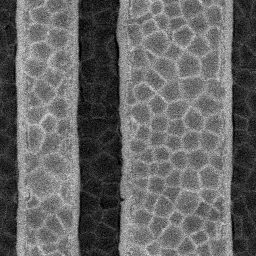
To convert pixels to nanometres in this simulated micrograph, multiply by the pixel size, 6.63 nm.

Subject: one or a few lines or trenches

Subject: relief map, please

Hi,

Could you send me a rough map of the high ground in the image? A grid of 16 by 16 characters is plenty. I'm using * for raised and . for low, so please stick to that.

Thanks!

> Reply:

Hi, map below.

.****...******..
.****...******..
.****...******..
.****...******..
.****...******..
.****...******..
.****...******..
.****...******..
.****...******..
.****...******..
.****...******..
.****...******..
.****...******..
.****...******..
.****...******..
.****...******..